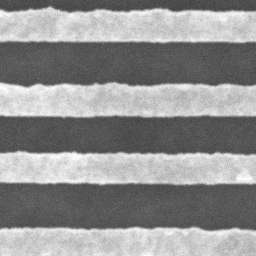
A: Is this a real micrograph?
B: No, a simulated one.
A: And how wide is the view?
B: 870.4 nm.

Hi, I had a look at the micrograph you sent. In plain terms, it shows lines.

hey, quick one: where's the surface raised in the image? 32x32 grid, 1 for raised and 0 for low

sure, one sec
00000000000000000000000000000000
10011111000111001111100111000000
11111111111111111111111111111111
11111111111111111111111111111111
11111111111111111111111111111111
00000000000000000000000000000000
00000000000000000000000000000000
00000000000000000000000000000000
00000000000000000000000000000000
00000000000000000000000000000000
10000000000001100000000000000000
11111111111111111111111111111111
11111111111111111111111111111111
11111111111111111111111111111111
00000001111100000111110000000000
00000000000000000000000000000000
00000000000000000000000000000000
00000000000000000000000000000000
00000000000000000000000000000000
11111111111111111111111111111101
11111111111111111111111111111111
11111111111111111111111111111111
11111111111111111111111111111111
00000000000000000000000000000000
00000000000000000000000000000000
00000000000000000000000000000000
00000000000000000000000000000000
00000000000000000000000000000000
00000000000000000000000000000000
11111111111111111111111111111111
11111111111111111111111111111111
11111111111111111111111111111111